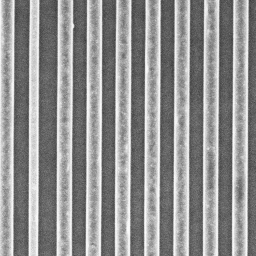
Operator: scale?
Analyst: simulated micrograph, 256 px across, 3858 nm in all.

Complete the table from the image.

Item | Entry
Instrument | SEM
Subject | parallel lines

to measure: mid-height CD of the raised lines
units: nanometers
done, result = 209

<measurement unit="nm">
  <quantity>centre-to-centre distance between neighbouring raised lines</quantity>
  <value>444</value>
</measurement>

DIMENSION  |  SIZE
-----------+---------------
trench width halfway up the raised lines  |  236 nm